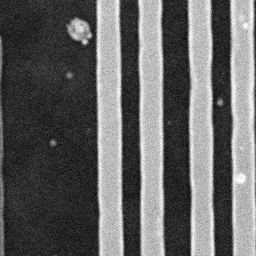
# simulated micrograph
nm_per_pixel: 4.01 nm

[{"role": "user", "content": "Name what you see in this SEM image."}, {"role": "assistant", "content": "wiring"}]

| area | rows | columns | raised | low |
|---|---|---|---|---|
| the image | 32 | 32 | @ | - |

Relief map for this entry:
------------@@@--@@@----@@---@@-
------------@@@---@@----@@---@@@
---------@--@@@---@@----@@---@@@
---------@@-@@@---@@----@@---@@-
---------@@-@@@---@@----@@---@@-
------------@@@---@@----@@---@@@
------------@@@---@@----@@---@@@
------------@@@---@@----@@---@@@
------------@@@---@@----@@---@@@
------------@@@---@@----@@---@@@
------------@@@---@@----@@---@@@
------------@@@---@@----@@---@@@
------------@@@---@@----@@---@@@
------------@@@---@@----@@---@@@
------------@@@---@@----@@---@@@
------------@@@---@@----@@---@@@
------------@@@---@@----@@---@@@
------------@@@---@@----@@---@@@
------------@@@---@@----@@---@@@
------------@@@---@@----@@---@@@
------------@@@---@@----@@---@@@
------------@@@---@@----@@---@@@
------------@@@---@@----@@---@@@
------------@@@---@@----@@---@@@
------------@@@---@@----@@---@@@
-------------@@---@@----@@---@@@
-------------@@---@@----@@---@@@
-------------@@---@@----@@@--@@@
-------------@@---@@----@@@--@@@
-------------@@---@@----@@@--@@@
-------------@@---@@----@@@--@@@
-------------@@---@@----@@@--@@@